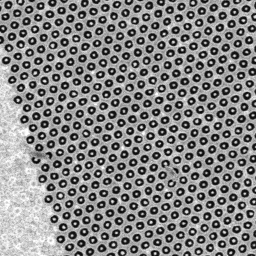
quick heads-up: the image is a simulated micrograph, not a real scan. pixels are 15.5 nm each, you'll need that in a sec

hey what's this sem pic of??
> a regular array of ring-shaped grooves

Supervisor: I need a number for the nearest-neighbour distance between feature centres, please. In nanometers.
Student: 181